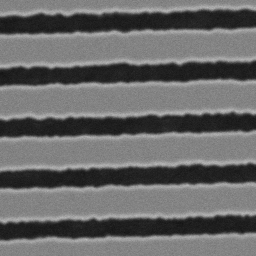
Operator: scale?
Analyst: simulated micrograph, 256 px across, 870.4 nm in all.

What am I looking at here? lines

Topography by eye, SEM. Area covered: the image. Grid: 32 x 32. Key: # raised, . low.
################################
##################..#...........
................................
................................
################################
################################
################################
################################
................................
................................
..........###.##################
################################
################################
################################
##################..............
................................
............................####
################################
################################
################################
########################.#####..
................................
................................
....#..#########################
################################
################################
################################
#######.....#...................
................................
...................#.###########
################################
################################